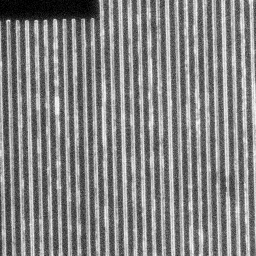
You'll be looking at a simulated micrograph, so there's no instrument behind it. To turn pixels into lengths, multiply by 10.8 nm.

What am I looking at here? parallel lines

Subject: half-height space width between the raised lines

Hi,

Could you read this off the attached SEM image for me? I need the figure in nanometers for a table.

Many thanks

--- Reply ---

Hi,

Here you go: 23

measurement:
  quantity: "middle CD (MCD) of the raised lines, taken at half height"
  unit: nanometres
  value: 77.3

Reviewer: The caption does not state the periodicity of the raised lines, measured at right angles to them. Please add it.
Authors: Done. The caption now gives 102 nm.